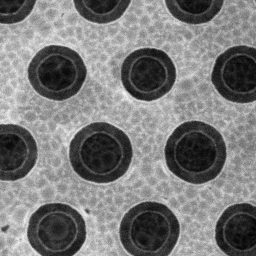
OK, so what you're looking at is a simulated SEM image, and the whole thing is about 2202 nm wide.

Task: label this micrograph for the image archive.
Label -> ring-shaped grooves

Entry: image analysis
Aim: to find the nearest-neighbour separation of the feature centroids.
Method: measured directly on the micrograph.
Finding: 91.7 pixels